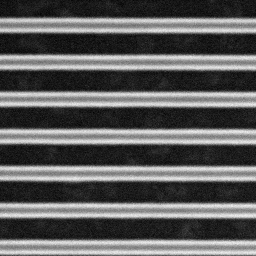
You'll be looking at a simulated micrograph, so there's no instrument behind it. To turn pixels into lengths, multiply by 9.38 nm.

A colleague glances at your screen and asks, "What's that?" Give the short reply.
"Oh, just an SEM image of parallel lines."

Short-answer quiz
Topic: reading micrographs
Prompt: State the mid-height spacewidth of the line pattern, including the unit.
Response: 0.233 microns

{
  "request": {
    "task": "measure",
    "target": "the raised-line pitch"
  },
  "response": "37 pixels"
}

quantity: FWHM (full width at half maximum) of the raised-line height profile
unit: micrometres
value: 0.113